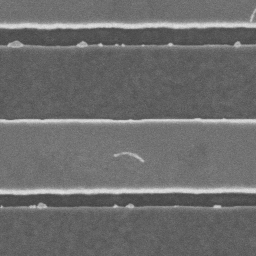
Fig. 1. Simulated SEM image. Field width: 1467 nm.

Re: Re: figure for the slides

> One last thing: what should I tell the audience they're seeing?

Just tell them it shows lines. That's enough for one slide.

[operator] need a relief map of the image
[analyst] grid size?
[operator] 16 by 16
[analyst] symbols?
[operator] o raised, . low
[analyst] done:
oooooooooooooooo
oooooooooooooooo
................
................
................
................
................
ooooooo.oooooooo
oooooooooooooooo
oooooooooooooooo
oooooooooooooooo
oooooooooooooooo
................
................
................
................